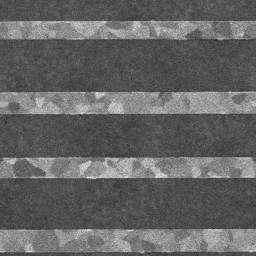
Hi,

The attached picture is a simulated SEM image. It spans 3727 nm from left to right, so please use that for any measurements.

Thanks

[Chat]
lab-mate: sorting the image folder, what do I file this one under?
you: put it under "one or a few lines or trenches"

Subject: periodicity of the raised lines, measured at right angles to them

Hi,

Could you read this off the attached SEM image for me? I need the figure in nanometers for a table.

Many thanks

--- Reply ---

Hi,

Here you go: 1020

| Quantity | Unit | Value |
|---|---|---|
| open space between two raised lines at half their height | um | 0.761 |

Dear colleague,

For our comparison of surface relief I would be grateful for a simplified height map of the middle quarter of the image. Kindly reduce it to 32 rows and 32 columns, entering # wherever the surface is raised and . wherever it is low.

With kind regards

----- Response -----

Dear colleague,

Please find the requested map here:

................................
................................
................................
................................
................................
................................
................................
################################
################################
################################
################################
################################
.##.............................
................................
................................
................................
................................
................................
................................
................................
................................
................................
................................
#####.....................#####.
################################
################################
################################
################################
......##........................
................................
................................
................................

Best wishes